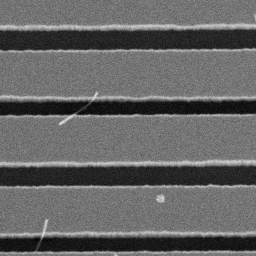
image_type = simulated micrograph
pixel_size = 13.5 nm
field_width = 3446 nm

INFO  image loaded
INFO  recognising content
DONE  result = lines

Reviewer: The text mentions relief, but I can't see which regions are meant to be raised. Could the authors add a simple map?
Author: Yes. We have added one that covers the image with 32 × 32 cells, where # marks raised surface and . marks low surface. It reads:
################################
################################
################################
##############.####.#.###.......
................................
................................
################################
################################
################################
################################
################################
################################
...........#....................
................................
################################
################################
################################
################################
################################
################################
##############..###.#.#.........
................................
................................
################################
################################
################################
################################
################################
################################
#..#.#..........................
................................
............#....##..###########